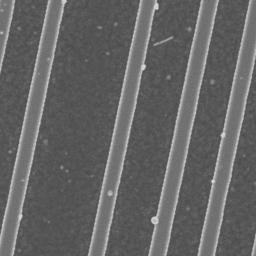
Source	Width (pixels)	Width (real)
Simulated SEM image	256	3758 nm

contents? lines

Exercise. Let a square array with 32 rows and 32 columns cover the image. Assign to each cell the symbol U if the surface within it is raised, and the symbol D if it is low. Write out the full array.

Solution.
UUDDDDUUDDDDDDDDDUUUDDDDDUUDDDDU
UUDDDDUUDDDDDDDDDUUDDDDDDUUDDDDU
UDDDDDUUDDDDDDDDDUUDDDDDDUUDDDDU
UDDDDUUDDDDDDDDDDUUDDDDDUUUDDDUU
UDDDDUUDDDDDDDDDDUUDDDDDUUDDDDUU
UDDDDUUDDDDDDDDDUUDDDDDDUUDDDDUU
UDDDDUUDDDDDDDDDUUDDDDDDUUDDDDUU
DDDDDUUDDDDDDDDDUUDDDDDDUUDDDDUU
DDDDUUDDDDDDDDDDUUDDDDDUUUDDDUUU
DDDDUUDDDDDDDDDDUUDDDDDUUDDDDUUD
DDDDUUDDDDDDDDDUUDDDDDDUUDDDDUUD
DDDDUUDDDDDDDDDUUDDDDDDUUDDDDUUD
DDDDUUDDDDDDDDDUUDDDDDDUUDDDDUUD
DDDUUDDDDDDDDDDUUDDDDDUUUDDDUUUD
DDDUUDDDDDDDDDDUUDDDDDUUDDDDUUDD
DDDUUDDDDDDDDDUUDDDDDDUUDDDDUUDD
DDDUUDDDDDDDDDUUDDDDDDUUDDDDUUDD
DDUUUDDDDDDDDDUUDDDDDDUUDDDDUUDD
DDUUDDDDDDDDDDUUDDDDDUUUDDDUUUDD
DDUUDDDDDDDDDDUUDDDDDUUDDDDUUDDD
DDUUDDDDDDDDDUUDDDDDDUUDDDDUUDDD
DDUUDDDDDDDDDUUDDDDDDUUDDDDUUDDD
DUUUDDDDDDDDDUUDDDDDDUUDDDDUUDDD
DUUDDDDDDDDDDUUDDDDDUUDDDDUUUDDD
DUUDDDDDDDDDDUUDDDDDUUDDDDUUDDDD
DUUDDDDDDDDDUUDDDDDDUUDDDDUUDDDD
DUUDDDDDDDDDUUDDDDDDUUDDDDUUDDDD
UUUDDDDDDDDDUUDDDDDUUUDDDDUUDDDD
UUDDDDDDDDDDUUDDDDDUUDDDDUUUDDDD
UUDDDDDDDDDDUUDDDDDUUDDDDUUDDDDD
UUDDDDDDDDDUUDDDDDDUUDDDDUUDDDDD
UUDDDDDDDDDUUDDDDDDUUDDDDUUDDDDD